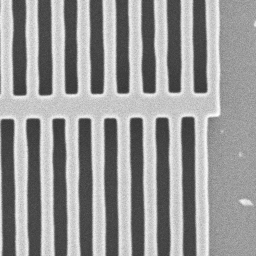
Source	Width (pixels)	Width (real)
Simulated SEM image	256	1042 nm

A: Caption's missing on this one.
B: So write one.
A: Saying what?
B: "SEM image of groups of lines, slits or small figures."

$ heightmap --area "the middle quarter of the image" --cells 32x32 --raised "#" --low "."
...####...###....##....###...###
...####...###....##....###...###
...####...###....##....###...###
...####...###....##....###...###
....###...###....##....###...###
....###...###....##....###...###
....###...###....###...###...###
#..####..#####.#################
################################
################################
################################
################################
################################
####..#####..####..####...###...
###....###...###....###...###...
###....###....##....###...###...
###....###....##....###...###...
###....###....##....###....##...
###....###....##....###....##...
.##....###....##....###....##...
.##....###....##....###...###...
.##....###....##....###...###...
.##....###....##....###...###...
.##....###....##....###...###...
.##....###....##....###...###...
.###...###....###...###...###...
.###...###....###...###....##...
.###...###....###...###....##...
.##....###....###...###....##...
.##....###....###...###....##...
.##....###....###...###....##...
.##....###....###...###....##...